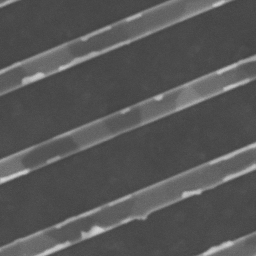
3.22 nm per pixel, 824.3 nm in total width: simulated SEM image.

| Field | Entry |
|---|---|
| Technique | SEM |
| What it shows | one or a few lines or trenches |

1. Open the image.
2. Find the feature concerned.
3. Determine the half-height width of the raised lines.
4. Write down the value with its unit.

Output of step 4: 76.4 nanometers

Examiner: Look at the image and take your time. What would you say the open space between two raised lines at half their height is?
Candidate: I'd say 0.191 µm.